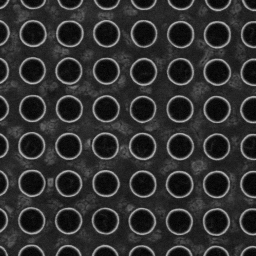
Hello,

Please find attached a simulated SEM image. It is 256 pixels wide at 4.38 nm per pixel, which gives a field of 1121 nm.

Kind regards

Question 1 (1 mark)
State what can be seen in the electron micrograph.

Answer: a regular array of raised bodies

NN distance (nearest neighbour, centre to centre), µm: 0.161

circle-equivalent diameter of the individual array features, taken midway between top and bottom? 116 nanometres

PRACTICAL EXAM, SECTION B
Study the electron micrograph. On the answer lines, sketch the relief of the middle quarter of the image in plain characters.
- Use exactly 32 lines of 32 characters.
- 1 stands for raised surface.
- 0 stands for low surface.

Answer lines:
11110000111111000111111000111111
11110001111111000111111000111111
11110000111111000111111000111111
11110000111110000111111000111111
11100000011100000011110000011110
00000000000000000000000000000000
00000000000000000000000000000000
00000000000000000000000000000000
11100000011100000011100000011110
11110000111110000111111000111111
11111001111111000111111000111111
11111001111111000111111000111111
11110001111111000111111000111111
11110000111110000111110000011110
00000000000000000001100000000000
00000000000000000000000000000000
00000000000000000000000000000000
11100000011100000001100000001100
11110000111110000111110000011111
11110001111110000111111000111111
11110001111110001111111000111111
11110001111110000111111000111111
11110000111110000111110000111111
11100000011100000011100000011110
00000000000000000000000000000000
00000000000000000000000000000000
00000000000000000000000000000000
11100000111110000011110000011110
11110001111110000111111000111111
11110001111111000111111000111111
11110001111111000111111000111111
11110000111110000111111000111111